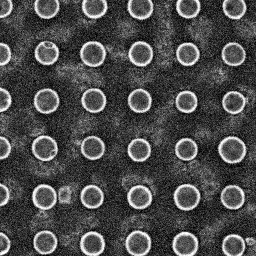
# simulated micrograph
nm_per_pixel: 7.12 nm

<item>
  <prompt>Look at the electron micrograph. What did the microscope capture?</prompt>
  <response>a regular array of raised bodies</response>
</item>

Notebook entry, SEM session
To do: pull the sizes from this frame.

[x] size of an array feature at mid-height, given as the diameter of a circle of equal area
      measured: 156 nm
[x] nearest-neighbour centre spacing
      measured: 331 nm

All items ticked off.